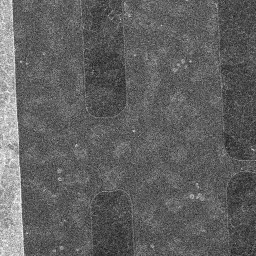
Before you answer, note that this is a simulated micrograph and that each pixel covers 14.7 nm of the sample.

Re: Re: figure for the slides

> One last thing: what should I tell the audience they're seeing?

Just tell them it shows one or a few lines or trenches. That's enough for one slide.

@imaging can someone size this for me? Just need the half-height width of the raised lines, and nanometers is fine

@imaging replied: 498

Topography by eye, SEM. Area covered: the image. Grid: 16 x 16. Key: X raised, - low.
X----XXX------XX
X----XXX------XX
X----XXX------XX
X----XXX------XX
X----XXX------XX
X----XXX------XX
X----XXX------XX
X-------------XX
X-------------XX
X-------------XX
X---------------
X-------------XX
X-----XX------XX
X-----XX------XX
X-----XX------XX
X-----XX------XX